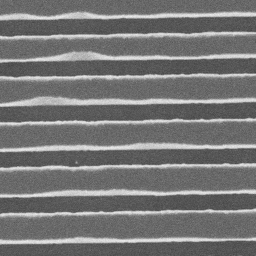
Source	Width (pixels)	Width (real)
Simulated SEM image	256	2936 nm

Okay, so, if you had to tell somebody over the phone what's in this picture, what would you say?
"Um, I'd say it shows lines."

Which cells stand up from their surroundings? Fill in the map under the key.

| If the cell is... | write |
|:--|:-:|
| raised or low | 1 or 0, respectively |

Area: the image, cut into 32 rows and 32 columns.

11111111111111111111111111111111
11111111111111111111111111111111
00000000000000000000000000000000
00000000000000000000000000000000
00000001111111111111111111111111
11111111111111111111111111111111
11111111111111111111111111111111
11110000000000000000000000000000
00000000000000000000000000000000
00000000000000000000011111111111
11111111111111111111111111111111
11111111111111111111111111111111
11111111111111111111111111111110
00000000000000000000000000000000
00000000000000000000000000000000
11111111111111111111111111111111
11111111111111111111111111111111
11111111111111111111111111111111
11111110100011000000000000000000
00000000000000000000000000000000
00000000000000000000000000000000
11111111111111111111111111111111
11111111111111111111111111111111
11111111111111111111111111111111
00000000000000000000000000000000
00000000000000000000000000000000
00000000000000010011111111111111
11111111111111111111111111111111
11111111111111111111111111111111
11111111111111111111111111111111
00000000000000000000000000000000
00000000000000000000000000000000